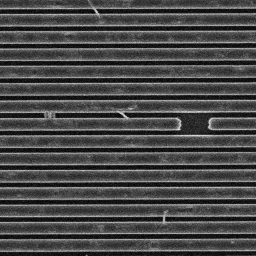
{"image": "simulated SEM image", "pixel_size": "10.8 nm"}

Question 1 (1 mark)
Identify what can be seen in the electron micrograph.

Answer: parallel lines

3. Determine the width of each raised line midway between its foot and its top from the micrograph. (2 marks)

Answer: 126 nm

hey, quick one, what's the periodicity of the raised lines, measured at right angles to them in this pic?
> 188 nanometres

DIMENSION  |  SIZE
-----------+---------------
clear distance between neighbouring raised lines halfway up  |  62.2 nm